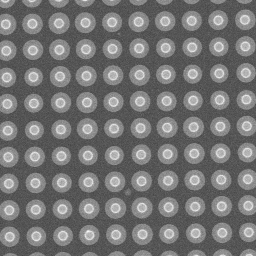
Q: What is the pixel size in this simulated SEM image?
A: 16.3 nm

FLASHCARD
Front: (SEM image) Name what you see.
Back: an array of small figures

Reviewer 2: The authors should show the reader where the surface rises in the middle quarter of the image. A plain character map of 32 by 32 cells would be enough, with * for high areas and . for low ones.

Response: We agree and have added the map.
...........**.....**....***....*
*..*****..****...****..*****..**
**.*****..*****.*****..*****..**
**.*****..*****.*****..*****..**
*..*****..****...****...***....*
................................
................................
....***....***...****...***....*
*..*****..*****..****..*****..**
**.*****..*****..****..*****..**
**.*****..*****..****...****..**
*...****...***....**....***....*
................................
.........................**....*
*...****...***...****...****..**
**.*****..*****..*****.*****..**
**.*****..*****..*****.*****..**
*...****..****...****...****..**
.....**.........................
................................
..................***...***....*
*...****...***...*****..****..**
**..****..*****..*****.*****..**
**..****..*****..*****..****..**
*...****...***....***...****...*
................................
................................
.....***...***....***...****...*
**..****..*****..*****..****..**
**..*****.*****..*****..****..**
**..****..*****..*****..****...*
*...****...***....**.....*......